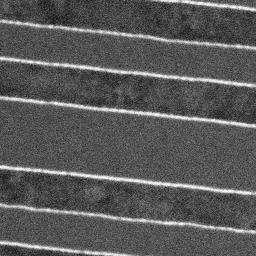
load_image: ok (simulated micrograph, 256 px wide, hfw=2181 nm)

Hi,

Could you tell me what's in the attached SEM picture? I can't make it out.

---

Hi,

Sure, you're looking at lines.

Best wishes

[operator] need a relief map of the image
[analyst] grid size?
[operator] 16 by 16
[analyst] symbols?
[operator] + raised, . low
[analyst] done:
...............+
++..............
+++++++++++.....
++++++++++++++++
.......+++++++++
................
++++............
+++++++++++++...
++++++++++++++++
++++++++++++++++
++++++++++++++++
..........++++++
................
+++++++.........
++++++++++++++++
...+++++++++++++